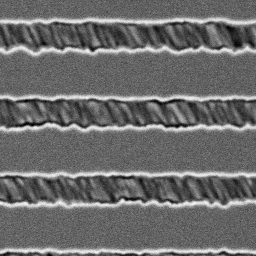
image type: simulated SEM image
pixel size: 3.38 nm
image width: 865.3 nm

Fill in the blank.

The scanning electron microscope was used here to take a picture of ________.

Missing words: lines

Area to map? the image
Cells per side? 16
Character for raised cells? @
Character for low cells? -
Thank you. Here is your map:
@@@@@@@@@@@@@@@@
----------------
----------------
@@@@@@@@@@@@@@@@
@@@@@@@@@@@@@@@@
@@@@@@@@@@@@@@@@
----------------
----------------
@@@@@@@@@@@@@@@@
@@@@@@@@@@@@@@@@
@@@@@@@@@@@@@@@@
----------------
----------------
@@@@@@@@@@@@@@@@
@@@@@@@@@@@@@@@@
@@@@@@@@@@@@@@@@